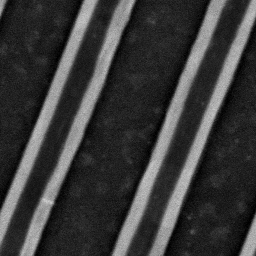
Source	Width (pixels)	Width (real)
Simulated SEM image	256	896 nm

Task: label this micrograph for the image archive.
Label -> one or a few lines or trenches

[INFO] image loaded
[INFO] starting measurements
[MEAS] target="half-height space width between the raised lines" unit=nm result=296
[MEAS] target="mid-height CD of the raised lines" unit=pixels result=34.7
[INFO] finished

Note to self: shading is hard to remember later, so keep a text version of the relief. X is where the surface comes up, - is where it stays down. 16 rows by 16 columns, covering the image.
-----XXX-----XXX
-----XX------XX-
-----XX------XX-
----XXX-----XXX-
----XX------XX--
----XX-----XXX--
---XX------XX---
---XX------XX---
--XXX-----XXX---
--XX------XX----
--XX------XX----
-XX------XX-----
-XX------XX-----
XXX-----XXX-----
XX------XX------
XX------XX------